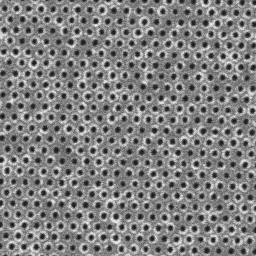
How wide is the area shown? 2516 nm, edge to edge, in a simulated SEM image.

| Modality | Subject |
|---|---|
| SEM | a regular array of holes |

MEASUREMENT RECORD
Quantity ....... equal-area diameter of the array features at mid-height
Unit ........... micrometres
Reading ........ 0.0607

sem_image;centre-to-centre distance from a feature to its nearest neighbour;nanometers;118